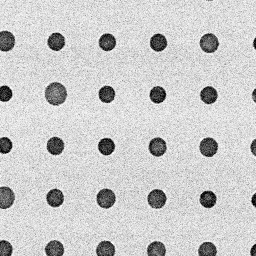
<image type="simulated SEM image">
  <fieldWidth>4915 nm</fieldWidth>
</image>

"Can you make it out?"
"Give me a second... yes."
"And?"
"a regular array of holes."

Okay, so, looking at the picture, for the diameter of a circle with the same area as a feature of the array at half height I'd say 0.357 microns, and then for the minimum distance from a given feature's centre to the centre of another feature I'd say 0.979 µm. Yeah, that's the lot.